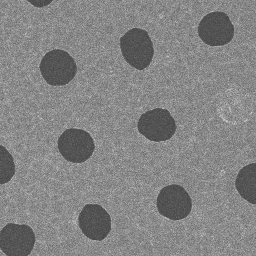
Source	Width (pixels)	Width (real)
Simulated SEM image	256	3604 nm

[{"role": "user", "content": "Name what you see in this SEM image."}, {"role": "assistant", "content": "holes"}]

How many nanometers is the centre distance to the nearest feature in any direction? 1120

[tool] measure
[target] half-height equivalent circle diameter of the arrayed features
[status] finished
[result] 501 nm